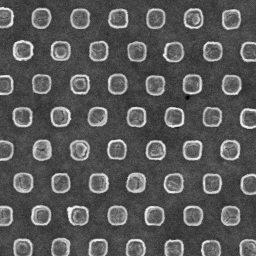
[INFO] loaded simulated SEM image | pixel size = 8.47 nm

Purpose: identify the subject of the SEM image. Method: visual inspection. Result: a regular array of raised bodies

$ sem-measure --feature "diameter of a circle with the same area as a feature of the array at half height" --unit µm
0.167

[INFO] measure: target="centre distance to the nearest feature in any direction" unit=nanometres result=315